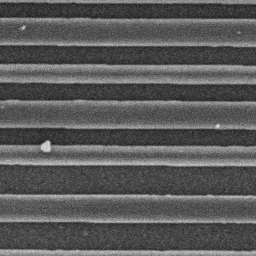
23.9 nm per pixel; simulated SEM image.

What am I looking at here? lines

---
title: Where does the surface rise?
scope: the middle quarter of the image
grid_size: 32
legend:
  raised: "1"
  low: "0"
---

11101110100000000000000000000000
11111111111111111111111111111111
11111111111111111111111111111111
11111111111111111111111111111111
00000000000000000000000000001011
00000000000000000000000000000000
00000000000000000000000000000000
00000000000000000000000000000000
00000000000000000000000000000000
11111111110110000000011100111000
11111111111111111111111111111111
11111111111111111111111111111111
11111111111111111111111111111111
11111111111111111111111111111111
11111111111111111111111111111111
11111111111111111111111111111111
00000000000000000000000000000000
00000000000000000000000000000000
00000000000000000000000000000000
00000000000000000000000000000000
00000000000000000000000000000000
11111111111111111111111111111111
11111111111111111111111111111111
11111111111111111111111111111111
11111111111111111111111111111111
00000000000000000000000000000000
00000000000000000000000000000000
00000000000000000000000000000000
00000000000000000000000000000000
00000000000000000000000000000000
00000000000000000000000000000000
00000000000000000000000000000000